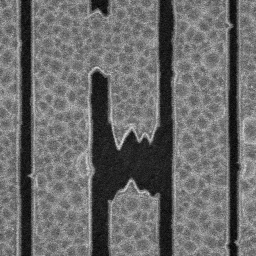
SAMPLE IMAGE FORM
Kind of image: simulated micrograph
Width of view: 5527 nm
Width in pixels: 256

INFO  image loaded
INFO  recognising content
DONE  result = one or a few lines or trenches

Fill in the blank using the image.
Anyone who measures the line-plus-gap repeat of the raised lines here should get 1510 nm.